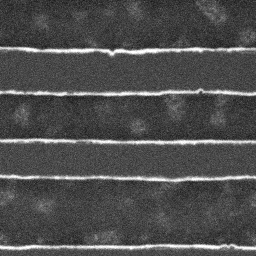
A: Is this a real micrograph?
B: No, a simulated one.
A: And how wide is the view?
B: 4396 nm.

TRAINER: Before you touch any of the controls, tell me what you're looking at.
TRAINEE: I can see one or a few lines or trenches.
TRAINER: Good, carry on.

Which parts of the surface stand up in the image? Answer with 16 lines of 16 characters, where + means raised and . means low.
................
................
................
++++++++++++++++
++++++++++++++++
++++++++++++++++
................
................
................
++++++++++++++++
++++++++++++++++
................
................
................
................
+++++++++++++++.